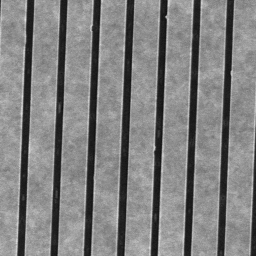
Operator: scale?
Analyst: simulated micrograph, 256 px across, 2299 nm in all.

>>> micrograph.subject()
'parallel lines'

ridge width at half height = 233 nm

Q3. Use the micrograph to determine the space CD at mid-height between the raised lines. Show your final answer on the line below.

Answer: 0.0695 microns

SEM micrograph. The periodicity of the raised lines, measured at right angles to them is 299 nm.